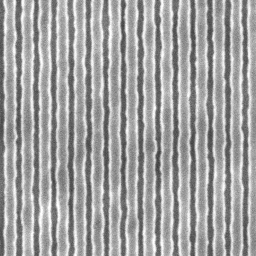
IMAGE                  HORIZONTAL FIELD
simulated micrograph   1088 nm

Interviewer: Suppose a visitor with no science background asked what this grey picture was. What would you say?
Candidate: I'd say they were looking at parallel lines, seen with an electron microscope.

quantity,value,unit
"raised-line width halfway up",11.2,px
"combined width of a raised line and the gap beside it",74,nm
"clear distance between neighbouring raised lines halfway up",0.026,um